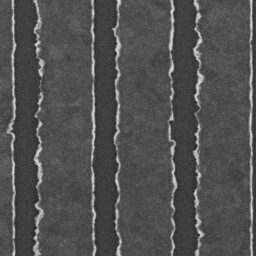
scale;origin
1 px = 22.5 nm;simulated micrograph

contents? one or a few lines or trenches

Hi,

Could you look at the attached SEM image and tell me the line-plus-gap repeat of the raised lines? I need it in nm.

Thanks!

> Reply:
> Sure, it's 1790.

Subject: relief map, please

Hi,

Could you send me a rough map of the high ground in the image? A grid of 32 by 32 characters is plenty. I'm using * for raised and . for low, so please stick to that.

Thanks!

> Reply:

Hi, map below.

**...*******...*******...******.
**...*******...*******...******.
**...*******...*******...******.
**..********..********...******.
**...*******..*******....******.
**...*******...******....******.
**...*******...******...*******.
**...*******..*******....******.
**...*******...******....******.
**...*******...******....******.
**...*******..*******....******.
**...*******...*******...******.
**...*******...******....******.
**...*******...******....******.
**...*******...******...*******.
**...*******...******....******.
*....*******...******....******.
**...*******..********...******.
**...*******..********...******.
**...*******...*******...******.
**...*******...*******...******.
**...*******...*******...******.
**...*******...*******...******.
**...*******...*******...******.
**...*******...*******..*******.
**...*******...*******...******.
**...*******...*******...******.
**...*******...*******...******.
**...*******...*******...******.
**...*******...*******...******.
**...*******...*******...******.
**...*******...*******...******.